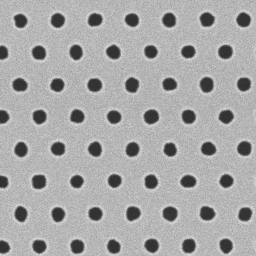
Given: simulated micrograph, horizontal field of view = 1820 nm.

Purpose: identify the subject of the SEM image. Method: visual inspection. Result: a regular array of holes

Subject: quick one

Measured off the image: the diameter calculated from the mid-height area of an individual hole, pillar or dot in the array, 102 nm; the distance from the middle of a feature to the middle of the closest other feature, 261 nanometres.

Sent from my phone